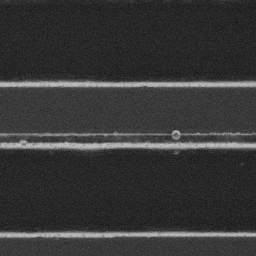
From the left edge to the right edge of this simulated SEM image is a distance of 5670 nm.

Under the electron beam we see lines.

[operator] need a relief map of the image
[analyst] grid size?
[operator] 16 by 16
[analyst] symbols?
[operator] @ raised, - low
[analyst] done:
----------------
----------------
----------------
----------------
----------------
@@@@@@@@@@@@@@@@
@@@@@@@@@@@@@@@@
@@@@@@@@@@@@@@@@
@@@@@@@@@@@@@@@@
----------------
----------------
----------------
----------------
----------------
----------------
@@@@@@@@@@@@@@@@